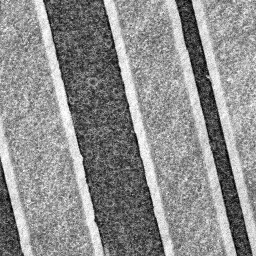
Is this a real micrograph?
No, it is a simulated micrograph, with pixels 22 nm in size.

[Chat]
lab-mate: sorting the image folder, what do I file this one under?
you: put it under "one or a few lines or trenches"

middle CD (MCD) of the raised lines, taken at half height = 1310 nm